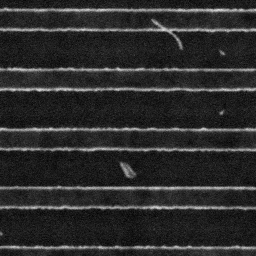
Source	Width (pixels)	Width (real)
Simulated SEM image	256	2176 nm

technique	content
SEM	lines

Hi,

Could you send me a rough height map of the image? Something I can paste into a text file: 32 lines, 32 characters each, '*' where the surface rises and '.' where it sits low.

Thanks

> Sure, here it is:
................................
********************************
********************************
********************************
................................
................................
................................
................................
................................
********************************
********************************
................................
................................
................................
................................
................................
********************************
********************************
********************************
................................
................................
................................
................................
********************************
********************************
********************************
................................
................................
................................
................................
................................
********************************